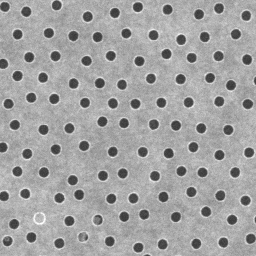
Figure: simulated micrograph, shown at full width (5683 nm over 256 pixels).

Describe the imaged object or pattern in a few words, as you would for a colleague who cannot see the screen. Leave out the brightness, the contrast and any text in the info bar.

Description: a regular array of holes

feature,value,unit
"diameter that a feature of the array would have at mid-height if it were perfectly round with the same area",231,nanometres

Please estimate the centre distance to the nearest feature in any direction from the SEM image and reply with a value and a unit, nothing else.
500 nm